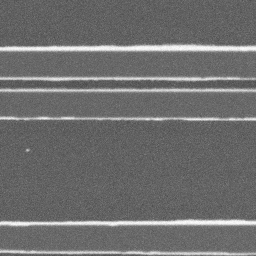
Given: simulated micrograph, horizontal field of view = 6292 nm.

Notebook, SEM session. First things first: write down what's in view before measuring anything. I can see lines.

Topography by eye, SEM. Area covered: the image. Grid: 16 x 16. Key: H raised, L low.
LLLLLLLLLLLLLLLL
LLLLLLLLLLLLLLLL
LLLLLLLLLLLLLLLL
HHHHHHHHHHHHHHHH
HHHHHHHHHHHHHHHH
HHHHHHHHHHHHHHHH
HHHHHHHHHHHHHHHH
LLLLLLLLLLLLLLLL
LLLLLLLLLLLLLLLL
LLLLLLLLLLLLLLLL
LLLLLLLLLLLLLLLL
LLLLLLLLLLLLLLLL
LLLLLLLLLLLLLLLL
LLLLLLLLLLLLLLLL
HHHHHHHHHHHHHHHH
HHHHHHHHHHHHHHHH